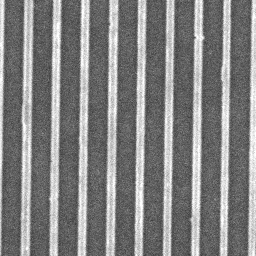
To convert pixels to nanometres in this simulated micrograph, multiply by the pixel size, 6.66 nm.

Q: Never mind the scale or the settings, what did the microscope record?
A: parallel lines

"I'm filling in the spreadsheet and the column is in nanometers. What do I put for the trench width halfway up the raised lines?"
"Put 146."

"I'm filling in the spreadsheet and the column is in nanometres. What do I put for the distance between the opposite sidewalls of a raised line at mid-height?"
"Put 45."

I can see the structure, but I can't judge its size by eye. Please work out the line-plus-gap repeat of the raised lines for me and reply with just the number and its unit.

189 nanometers